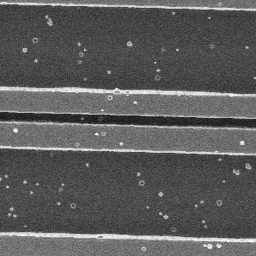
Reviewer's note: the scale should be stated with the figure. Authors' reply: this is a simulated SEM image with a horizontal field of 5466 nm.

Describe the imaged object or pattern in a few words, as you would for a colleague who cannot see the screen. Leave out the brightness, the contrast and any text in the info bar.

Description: lines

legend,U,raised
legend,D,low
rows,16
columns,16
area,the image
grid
DDDDDDDDDDDDDUUU
DDDDDDDDDDDDDDDD
DDDDDDDDDDDDDDDD
DDDDDDDDDDDDDDDD
DDDDDDDDDDDDDDDD
DDDDDDDDDDDDDDDD
UUUUUUUUUUUUUUUU
UUUUUUUUUUUUUUUU
UUUUUUUUUUUUUUUU
DDDDDDDDDDDUUUUU
DDDDDDDDDDDDDDDD
DDDDDDDDDDDDDDDD
DDDDDDDDDDDDDDDD
DDDDDDDDDDDDDDDD
DDDDDDDDDDDDDDDD
UUUUUUUUUUUUUUUU